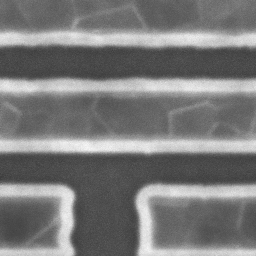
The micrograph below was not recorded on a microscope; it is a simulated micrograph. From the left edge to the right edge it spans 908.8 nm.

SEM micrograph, one or a few lines or trenches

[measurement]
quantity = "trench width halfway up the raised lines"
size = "157 nm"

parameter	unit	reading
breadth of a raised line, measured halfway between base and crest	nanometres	220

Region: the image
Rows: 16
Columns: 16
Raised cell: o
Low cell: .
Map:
oooooooooooooooo
oooooooooooooooo
......o.ooo.oooo
................
................
oooooooooooooooo
oooooooooooooooo
oooooooooooooooo
oooooooooooooooo
................
................
................
oooo.....ooooooo
oooo.....ooooooo
oooo.....ooooooo
oooo.....ooooooo